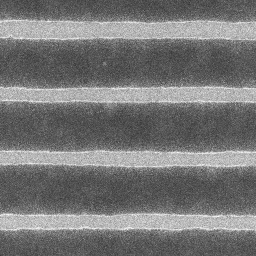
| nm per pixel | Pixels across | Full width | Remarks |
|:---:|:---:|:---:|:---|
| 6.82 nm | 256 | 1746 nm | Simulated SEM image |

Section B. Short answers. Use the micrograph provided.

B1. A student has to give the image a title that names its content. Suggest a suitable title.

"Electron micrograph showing one or a few lines or trenches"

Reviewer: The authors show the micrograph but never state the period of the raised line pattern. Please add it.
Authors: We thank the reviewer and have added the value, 434 nanometres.